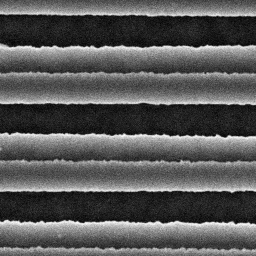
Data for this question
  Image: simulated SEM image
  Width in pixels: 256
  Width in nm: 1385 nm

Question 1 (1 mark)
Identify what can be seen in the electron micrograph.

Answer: lines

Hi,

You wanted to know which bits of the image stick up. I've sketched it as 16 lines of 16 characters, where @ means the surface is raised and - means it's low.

@@@@@@@@@@@@@@@@
----------------
----------------
@@@@@@@@@@@@@@@@
@@@@@@@@@@@@@@@@
@@@@@@@@@@@@@@@@
--------------@@
----------------
@@@@@@@@@@@@@---
@@@@@@@@@@@@@@@@
@@@@@@@@@@@@@@@@
@@@@@@@@@@@@@@@@
----------------
----------------
@@@@@@@@@@@@@@@@
@@@@@@@@@@@@@@@@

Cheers